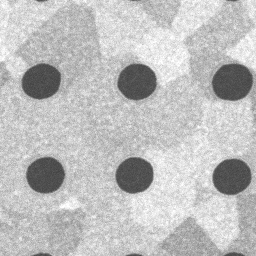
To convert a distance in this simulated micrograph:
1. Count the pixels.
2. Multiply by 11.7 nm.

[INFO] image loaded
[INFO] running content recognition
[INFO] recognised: holes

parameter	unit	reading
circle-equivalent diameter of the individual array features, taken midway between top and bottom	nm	449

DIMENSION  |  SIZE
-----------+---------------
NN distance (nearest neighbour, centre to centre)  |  1.1 um